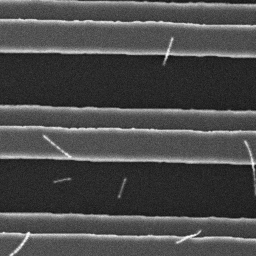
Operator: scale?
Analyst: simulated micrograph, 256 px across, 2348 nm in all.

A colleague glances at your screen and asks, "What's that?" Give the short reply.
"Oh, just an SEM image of lines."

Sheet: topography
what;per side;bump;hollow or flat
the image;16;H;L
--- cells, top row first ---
HHHHHHHHHHHHHHHH
HHHHHHHHHHHHHHHH
HHHHHHHHHHHHHHHH
LLLLLLLLLLLLLLHH
LLLLLLLLLLLLLLLL
LLLLLLLLLLLLLLLL
LLLLLLLLLLLLLLLL
HHHHHHHHHHHHHHHH
HHHHHHHHHHHHHHHH
HHHHHHHHHHHHHHHH
LLLLLLLLLLLLLLLL
LLLLLLLLLLLLLLLL
LLLLLLLLLLLLLLLL
HHHHHHLLLLLLLLLL
HHHHHHHHHHHHHHHH
HHHHHHHHHHHHHHHH